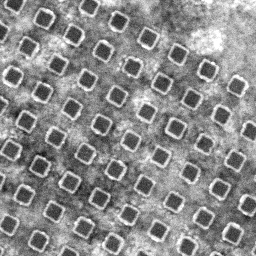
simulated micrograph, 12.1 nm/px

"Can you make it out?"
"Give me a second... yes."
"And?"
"a regular array of raised bodies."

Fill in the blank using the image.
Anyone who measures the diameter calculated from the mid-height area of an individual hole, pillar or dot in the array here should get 225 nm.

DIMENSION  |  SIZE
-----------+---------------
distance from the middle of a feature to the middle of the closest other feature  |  397 nm